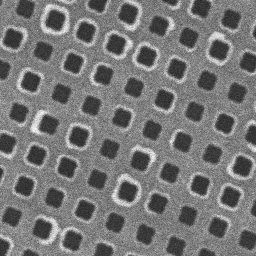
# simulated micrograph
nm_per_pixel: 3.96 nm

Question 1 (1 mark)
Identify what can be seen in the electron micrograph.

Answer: a regular array of holes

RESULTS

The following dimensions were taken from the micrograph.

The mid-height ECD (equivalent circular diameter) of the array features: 19.6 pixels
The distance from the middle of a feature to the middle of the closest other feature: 0.129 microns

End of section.